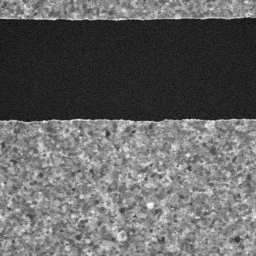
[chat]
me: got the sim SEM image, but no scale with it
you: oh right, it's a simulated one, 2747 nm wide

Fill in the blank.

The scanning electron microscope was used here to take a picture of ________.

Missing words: one or a few lines or trenches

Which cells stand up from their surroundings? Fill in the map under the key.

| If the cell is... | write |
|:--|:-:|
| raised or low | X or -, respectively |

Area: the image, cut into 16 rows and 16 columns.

XXXXXXXXXXXXXXXX
----------------
----------------
----------------
----------------
----------------
----------------
---------------X
XXXXXXXXXXXXXXXX
XXXXXXXXXXXXXXXX
XXXXXXXXXXXXXXXX
XXXXXXXXXXXXXXXX
XXXXXXXXXXXXXXXX
XXXXXXXXXXXXXXXX
XXXXXXXXXXXXXXXX
XXXXXXXXXXXXXXXX